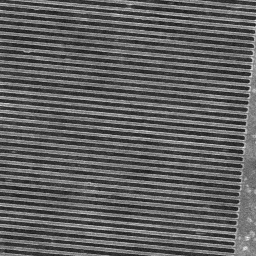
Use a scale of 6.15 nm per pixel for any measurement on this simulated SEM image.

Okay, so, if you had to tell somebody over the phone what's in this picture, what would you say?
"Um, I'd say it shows parallel lines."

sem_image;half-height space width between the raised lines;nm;24.5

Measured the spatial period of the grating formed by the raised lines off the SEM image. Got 43.6 nm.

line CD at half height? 19.1 nm